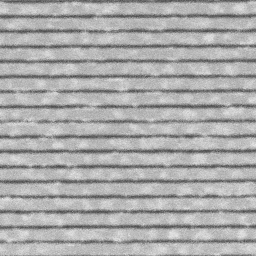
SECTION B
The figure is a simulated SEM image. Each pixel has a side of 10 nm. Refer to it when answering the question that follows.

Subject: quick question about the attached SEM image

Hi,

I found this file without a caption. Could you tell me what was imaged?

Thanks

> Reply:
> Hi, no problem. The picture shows parallel lines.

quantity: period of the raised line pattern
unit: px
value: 15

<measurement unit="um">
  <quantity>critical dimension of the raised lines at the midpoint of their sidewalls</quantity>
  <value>0.12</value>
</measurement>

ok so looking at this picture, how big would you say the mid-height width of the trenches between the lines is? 33.7 nm